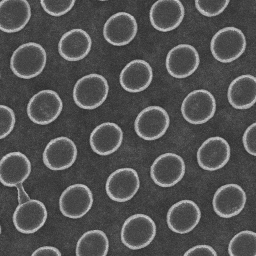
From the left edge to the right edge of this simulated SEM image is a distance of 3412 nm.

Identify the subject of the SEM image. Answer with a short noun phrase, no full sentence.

a regular array of raised bodies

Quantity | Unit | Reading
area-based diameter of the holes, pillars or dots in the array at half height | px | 32.1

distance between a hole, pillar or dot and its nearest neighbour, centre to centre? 644 nm